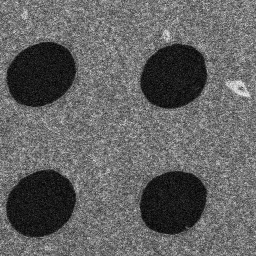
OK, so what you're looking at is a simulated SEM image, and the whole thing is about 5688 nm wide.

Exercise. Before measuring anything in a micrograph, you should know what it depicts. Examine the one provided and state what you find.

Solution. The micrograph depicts holes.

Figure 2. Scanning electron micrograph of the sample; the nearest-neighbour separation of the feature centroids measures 128 px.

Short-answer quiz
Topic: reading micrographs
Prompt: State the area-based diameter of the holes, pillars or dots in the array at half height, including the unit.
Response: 1480 nm